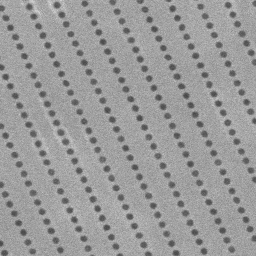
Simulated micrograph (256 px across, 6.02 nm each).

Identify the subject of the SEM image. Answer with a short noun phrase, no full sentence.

a regular array of holes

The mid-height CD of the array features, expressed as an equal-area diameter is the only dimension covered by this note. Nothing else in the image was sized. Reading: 0.0421 µm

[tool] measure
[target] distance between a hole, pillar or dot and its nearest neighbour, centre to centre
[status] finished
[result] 62.6 nanometres